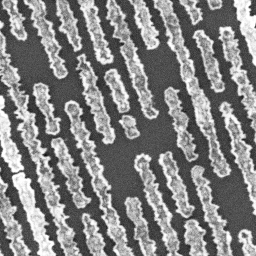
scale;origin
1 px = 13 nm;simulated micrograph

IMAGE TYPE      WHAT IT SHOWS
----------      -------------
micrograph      parallel lines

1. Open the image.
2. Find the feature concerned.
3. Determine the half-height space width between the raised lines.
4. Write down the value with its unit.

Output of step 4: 161 nm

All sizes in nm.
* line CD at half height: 145